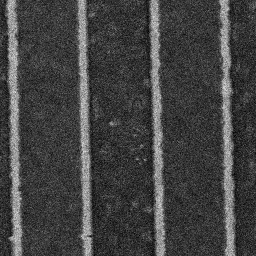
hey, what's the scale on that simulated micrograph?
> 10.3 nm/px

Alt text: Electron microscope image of one or a few lines or trenches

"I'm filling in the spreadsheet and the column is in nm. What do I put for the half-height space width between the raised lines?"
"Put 756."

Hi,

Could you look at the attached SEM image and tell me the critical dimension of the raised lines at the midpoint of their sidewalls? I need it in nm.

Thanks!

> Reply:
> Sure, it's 712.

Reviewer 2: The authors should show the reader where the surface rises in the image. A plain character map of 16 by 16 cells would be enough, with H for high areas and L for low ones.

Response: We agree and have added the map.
LHHHHLLLLLHHHHLL
LHHHHLLLLLHHHHLL
LHHHHLLLLLHHHHLL
LHHHHLLLLLHHHHLL
LHHHHLLLLLHHHHLL
LHHHHLLLLLHHHHLL
LHHHHLLLLLHHHHLL
LHHHHLLLLLHHHHLL
LHHHHLLLLLHHHHLL
LHHHHLLLLLHHHHLL
LHHHHLLLLLHHHHLL
LHHHHLLLLLHHHHLL
LHHHHLLLLLHHHHLL
LHHHHLLLLLHHHHLL
LHHHHLLLLLHHHHLL
LHHHHLLLLLHHHHLL